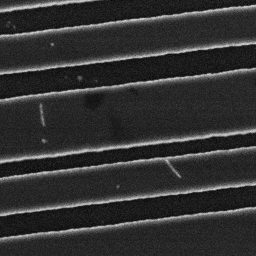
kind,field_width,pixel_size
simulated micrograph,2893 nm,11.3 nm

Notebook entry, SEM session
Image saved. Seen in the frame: lines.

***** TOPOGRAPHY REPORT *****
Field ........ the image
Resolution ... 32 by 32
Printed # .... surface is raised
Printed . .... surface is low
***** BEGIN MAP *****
#######.........................
.........................#######
................################
........########################
################################
###############################.
#######################.........
###############.................
#######.........................
........................########
................################
.......#########################
################################
################################
################################
################################
###############################.
#######################.........
##############.................#
#######...............##########
..............##################
......##########################
################################
############################....
####################............
############....................
###........................#####
...................#############
...........#####################
..##############################
################################
################################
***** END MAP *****